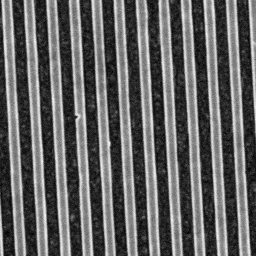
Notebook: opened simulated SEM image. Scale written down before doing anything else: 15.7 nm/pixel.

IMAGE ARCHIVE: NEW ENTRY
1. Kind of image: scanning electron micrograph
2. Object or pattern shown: parallel lines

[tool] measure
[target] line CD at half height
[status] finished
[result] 0.147 microns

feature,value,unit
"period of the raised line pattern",352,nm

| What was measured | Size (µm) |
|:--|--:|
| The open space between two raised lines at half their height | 0.2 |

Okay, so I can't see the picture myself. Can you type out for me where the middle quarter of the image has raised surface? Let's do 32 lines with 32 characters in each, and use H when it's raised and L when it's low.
LLHHLLLLHHLLLLHHLLLHHLLLLHHLLLHH
LLHHLLLLHHLLLLHHLLLHHLLLLHHLLLHH
LLHHHLLLHHLLLLHHLLLHHLLLLHHLLLHH
LLHHHLLLHHLLLLHHLLLHHLLLLHHLLLHH
LLLHHLLLHHLLLLHHLLLHHLLLLHHLLLLH
LLLHHLLLHHLLLLHHLLLHHLLLLHHLLLLH
LLLHHLLLHHLLLLHHLLLHHHLLLHHLLLLH
LLLHHLLLHHHLLLHHLLLLHHLLLHHLLLLH
LLLHHLLLHHHLLLHHLLLLHHLLLHHLLLLH
LLLHHLLLLHHLLLHHLLLLHHLLLHHLLLLH
LLLHHLLLLHHLLLHHLLLLHHLLLHHLLLLH
LLLHHLLLLHHLLLHHLLLLHHLLLHHHLLLH
LLLHHLLLLHHLLLHHLLLLHHLLLHHHLLLH
LLLHHLLLLHHLLLHHLLLLHHLLLLHHLLLH
LLLHHLLLLHHLLLHHLLLLHHLLLHHHLLLH
LLLHHLLLLHHLLLHHHLLLHHLLLHHHLLLH
LLLHHLLLLHHLLLHHHLLLHHLLLHHHLLLH
LLLHHLLLLHHLLLHHHLLLHHLLLLHHLLLH
LLLHHLLLLHHLLLLHHLLLHHLLLLHHLLLL
LLLHHLLLLHHLLLLHHLLLHHLLLLHHLLLL
LLLHHHLLLHHLLLHHHLLLHHLLLLHHLLLL
LLLHHHLLLHHLLLHHHLLLHHLLLLHHLLLH
LLLLHHLLLHHLLLLHHLLLHHLLLLHHLLLL
LLLLHHLLLHHLLLLHHLLLHHLLLLHHLLLL
LLLLHHLLLHHLLLLHHLLLHHHLLLHHLLLL
LLLLHHLLLHHHLLLHHLLLHHHLLLHHLLLL
LLLLHHLLLHHHLLLHHLLLLHHLLLHHLLLL
LLLLHHLLLHHHLLLHHLLLLHHLLLHHLLLL
LLLLHHLLLLHHLLLHHLLLLHHLLLHHLLLL
HLLLHHLLLLHHLLLHHLLLLHHLLLHHHLLL
HLLLHHLLLLHHLLLHHLLLLHHLLLHHHLLL
HLLLHHLLLLHHLLLHHLLLLHHLLLHHHLLL